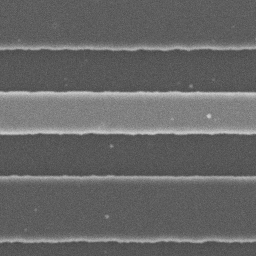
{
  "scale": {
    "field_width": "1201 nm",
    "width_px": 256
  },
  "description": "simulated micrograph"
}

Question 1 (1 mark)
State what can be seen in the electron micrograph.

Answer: lines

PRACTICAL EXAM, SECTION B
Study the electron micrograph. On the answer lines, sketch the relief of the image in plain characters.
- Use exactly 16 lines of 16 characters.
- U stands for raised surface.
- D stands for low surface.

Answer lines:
UUUUUUUUUUUUUUUU
UUUUUUUUUUUUUUUU
UUUUUUUUUUUUUUUU
DDDDDDDDDDDDDDDD
DDDDDDDDDDDDDDDD
DDDDDDDDDDDDDDDD
UUUUUUUUUUUUUUUU
UUUUUUUUUUUUUUUU
DDDDDDDDDDDDDDDD
DDDDDDDDDDDDDDDD
DDDDDDDDDDDDDDDD
UUUUUUUUUUUUUUUU
UUUUUUUUUUUUUUUU
UUUUUUUUUUUUUUUU
UUUUUUUUUUUUUUUU
DDDDDDDDDDDDDDDD